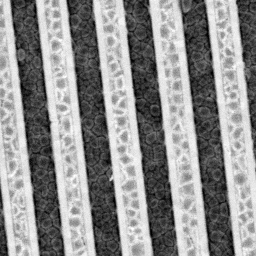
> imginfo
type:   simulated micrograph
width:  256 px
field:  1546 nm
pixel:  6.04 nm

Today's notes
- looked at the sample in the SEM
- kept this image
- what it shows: parallel lines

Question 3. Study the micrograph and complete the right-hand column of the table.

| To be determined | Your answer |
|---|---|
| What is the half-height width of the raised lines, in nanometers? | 139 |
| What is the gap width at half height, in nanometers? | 200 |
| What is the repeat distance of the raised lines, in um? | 0.339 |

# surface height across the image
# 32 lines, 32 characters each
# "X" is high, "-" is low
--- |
X----XXX----XXX----XXX----XXX---
X----XXX----XXX----XXX----XXX---
X----XXX----XXX----XXX----XXX---
X----XXX----XXX----XXX-----XX---
X-----XX-----XX-----XX-----XXX--
X-----XXX----XXX----XXX----XXX--
XX----XXX----XXX----XXX----XXX--
XX----XXX----XXX----XXX----XXX--
XX----XXX----XXX----XXX----XXX--
XX----XXX----XXX----XXX----XXX--
XX----XXX----XXX----XXX----XXX--
XX----XXX----XXX----XXX----XXX--
XX----XXX----XXX-----XX-----XX--
XX-----XX-----XX-----XXX----XXX-
XX-----XXX----XXX----XXX----XXX-
XXX----XXX----XXX----XXX----XXX-
XXX----XXX----XXX----XXX----XXX-
XXX----XXX----XXX----XXX----XXX-
XXX----XXX----XXX----XXX----XXX-
XXX----XXX----XXX----XXX----XXX-
XXX----XXX----XXX----XXX----XXX-
XXX----XXX-----XX-----XX-----XX-
XXX-----XX-----XXX----XXX----XXX
-XXX----XXX----XXX----XXX----XXX
-XXX----XXX----XXX----XXX----XXX
-XXX----XXX----XXX----XXX----XXX
-XXX----XXX----XXX----XXX----XXX
-XXX----XXX----XXX----XXX----XXX
-XXX----XXX----XXX----XXX----XXX
-XXX----XXX----XXX----XXX-----XX
-XXX-----XX-----XX-----XX-----XX
--XX-----XX-----XXX----XXX----XX